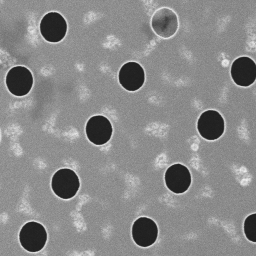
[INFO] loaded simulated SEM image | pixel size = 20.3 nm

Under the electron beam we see a regular array of holes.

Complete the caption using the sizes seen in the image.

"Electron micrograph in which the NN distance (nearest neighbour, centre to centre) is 1.28 um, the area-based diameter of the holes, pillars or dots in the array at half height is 581 nanometers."